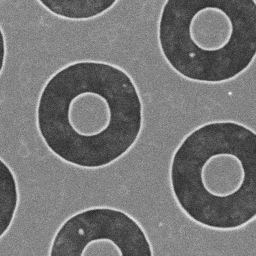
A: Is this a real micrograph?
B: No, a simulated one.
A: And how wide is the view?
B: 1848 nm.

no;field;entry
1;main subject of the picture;ring-shaped grooves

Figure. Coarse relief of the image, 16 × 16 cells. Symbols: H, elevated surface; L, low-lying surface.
HHHLLLLHHHLLLLLL
HHHHHHHHHHLLHHLL
HHHHHHHHHHLLHHLL
HHHHHHHHHHLLLLLL
HHHHLLLLHHHLLLLH
HHHLLLLLHHHHHHHH
HHLLHHHLLHHHHHHH
HHLLHHHLLHHHHHHH
HHHLLLLLLHHHLLLL
HHHLLLLLHHHLLLLL
HHHHHHHHHHHLLHHL
LHHHHHHHHHHLLHHL
LHHHHHHHHHHLLLLL
LHHHHLLLHHHHLLLL
HHHHLLLLLHHHHHHH
HHHLLHHLLHHHHHHH